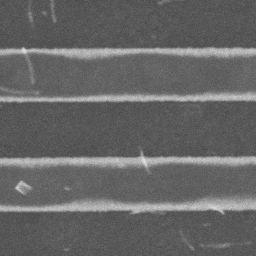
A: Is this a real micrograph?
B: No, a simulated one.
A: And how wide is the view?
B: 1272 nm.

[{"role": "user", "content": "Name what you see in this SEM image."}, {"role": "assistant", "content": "lines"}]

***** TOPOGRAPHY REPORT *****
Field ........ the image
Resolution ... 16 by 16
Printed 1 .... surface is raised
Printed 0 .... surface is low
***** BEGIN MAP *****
0000000000000000
0000000000000000
0000000000000000
1111111111111111
1111111111111111
1111111111111111
0000000000000000
0000000000000000
0000000000000000
0000000000000000
1111111111111111
1111111111111111
1111111111111111
0000000000000000
0000000000000000
0000000000000000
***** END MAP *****